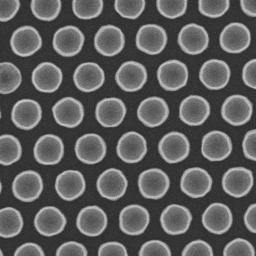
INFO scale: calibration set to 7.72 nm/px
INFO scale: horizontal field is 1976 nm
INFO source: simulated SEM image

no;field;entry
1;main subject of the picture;a regular array of raised bodies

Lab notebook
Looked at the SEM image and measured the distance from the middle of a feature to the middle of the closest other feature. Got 318 nm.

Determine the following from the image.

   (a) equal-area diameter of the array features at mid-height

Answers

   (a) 222 nm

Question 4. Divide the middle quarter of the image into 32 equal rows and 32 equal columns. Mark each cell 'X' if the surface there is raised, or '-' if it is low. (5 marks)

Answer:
----XXXXX------XXXX-----XXXXXX--
---XXXXXX-----XXXXXX----XXXXXXX-
---XXXXXXX---XXXXXXX----XXXXXXX-
---XXXXXXX---XXXXXXX----XXXXXXX-
---XXXXXXX----XXXXXX----XXXXXX--
---XXXXXX-----XXXXX------XXXXX--
-----XX-------------------------
--------------------------------
-------------------------------X
XXX------XXXXX------XXXXX-----XX
XXXX-----XXXXXX----XXXXXXX---XXX
XXXX----XXXXXXX----XXXXXXX---XXX
XXXXX---XXXXXXX----XXXXXXX---XXX
XXXX----XXXXXXX----XXXXXX----XXX
XXXX-----XXXXX------XXXX------XX
-X--------XXX-------------------
--------------------------------
----------------XX---------XX---
----XXXXX-----XXXXXX-----XXXXX--
---XXXXXXX----XXXXXX----XXXXXXX-
---XXXXXXX----XXXXXX----XXXXXXX-
---XXXXXXX----XXXXXX----XXXXXXX-
---XXXXXXX----XXXXXX-----XXXXXX-
----XXXXX-----XXXXX------XXXXX--
------XX------------------------
--------------------------------
-----------XX---------X--------X
XXXX------XXXX------XXXXX-----XX
XXXXX----XXXXXX----XXXXXXX----XX
XXXXX----XXXXXX----XXXXXXX----XX
XXXXX----XXXXXX----XXXXXXX---XXX
XXXXX----XXXXXX----XXXXXX-----XX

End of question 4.